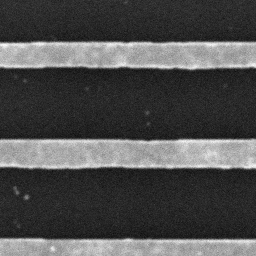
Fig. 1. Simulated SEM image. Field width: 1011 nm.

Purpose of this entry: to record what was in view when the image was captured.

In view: lines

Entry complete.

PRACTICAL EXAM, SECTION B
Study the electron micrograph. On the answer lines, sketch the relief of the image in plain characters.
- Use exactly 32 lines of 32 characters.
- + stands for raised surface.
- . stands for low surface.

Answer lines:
................................
................................
................................
................................
................................
++++++++++++++++++++++++++++++++
++++++++++++++++++++++++++++++++
++++++++++++++++++++++++++++++++
.......................++.......
................................
................................
................................
................................
................................
................................
................................
................................
................................
++++++++++++++++++++++++++++++++
++++++++++++++++++++++++++++++++
++++++++++++++++++++++++++++++++
................................
................................
................................
................................
................................
................................
................................
................................
................................
++++++++++++++++++++++++++++++++
++++++++++++++++++++++++++++++++